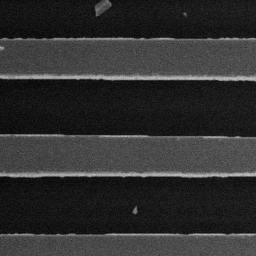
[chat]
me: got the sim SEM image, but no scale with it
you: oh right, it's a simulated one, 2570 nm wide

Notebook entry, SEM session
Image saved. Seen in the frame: lines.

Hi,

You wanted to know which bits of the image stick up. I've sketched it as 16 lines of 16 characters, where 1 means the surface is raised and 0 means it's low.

0000000000000000
0000000000000000
1111111111111111
1111111111111111
1111111111111111
0000000000000000
0000000000000000
0000000000000000
1111000000000000
1111111111111111
1111111111111111
0000000000000000
0000000000000000
0000000000000000
0000000000000000
1111111111111111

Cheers